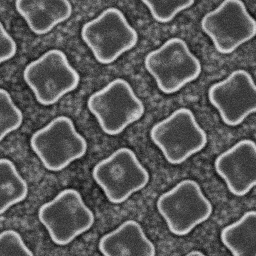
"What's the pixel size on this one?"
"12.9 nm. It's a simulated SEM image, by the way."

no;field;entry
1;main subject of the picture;a regular array of raised bodies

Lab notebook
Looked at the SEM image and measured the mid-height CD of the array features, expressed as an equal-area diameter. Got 0.627 µm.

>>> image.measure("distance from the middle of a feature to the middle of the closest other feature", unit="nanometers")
888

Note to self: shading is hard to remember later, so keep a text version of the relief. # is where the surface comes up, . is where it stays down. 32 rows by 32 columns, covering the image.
..#######.........######....##..
..#######....##....###.....####.
...#####....####....#....#######
....##.....#####.........#######
#.........#######.........######
##.........######....##....###..
##....#.....###....#####........
.....###....##....#######.......
...######.........#######.......
...#######.........#####.....##.
....######....##....###....#####
#...####.....####.........######
#....##....######.........######
##.........#######.........#####
###.........######...###....###.
##....###....###....#####.......
#....#####...##....######.......
....######.........#######......
....#######.........#####....###
.....#####....###....##.....####
##....##....#####..........#####
##..........######.........#####
###.........######..........####
###..........#####....###....##.
###....###...###....#####.......
#.....####..........######......
.....######.........######.....#
.....#######.........####.....##
......#####....###...###....####
##....###....#####..........####
###..........######.........####
####.........######..........###